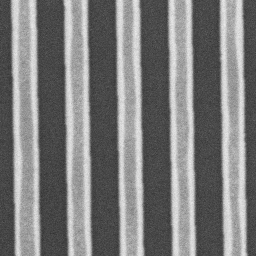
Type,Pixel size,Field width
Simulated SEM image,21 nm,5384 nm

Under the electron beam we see lines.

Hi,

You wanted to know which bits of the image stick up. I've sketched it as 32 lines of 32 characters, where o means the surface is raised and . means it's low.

..oo....ooo....oo....ooo....oo..
..oo....ooo....oo....ooo....oo..
..oo....ooo....oo....ooo....oo..
..oo....ooo....oo.....oo....oo..
..oo....ooo....oo.....oo....oo..
..oo....ooo....oo.....oo....oo..
..oo....ooo....oo.....oo....oo..
..oo....ooo....oo.....oo....oo..
..oo....ooo....oo.....oo....oo..
..oo....ooo....oo.....oo....oo..
..oo....ooo....oo.....oo....oo..
..oo....ooo....oo.....oo....oo..
..oo.....oo....oo.....oo....oo..
..oo.....oo....oo.....oo....oo..
..oo.....oo....oo.....oo....oo..
..oo.....oo....oo.....oo....oo..
..oo.....oo....oo.....oo....oo..
..oo.....oo....oo.....oo....oo..
..ooo....oo....oo.....oo....oo..
..ooo....oo....oo.....oo....oo..
..ooo....oo....oo.....oo....oo..
..ooo....oo....oo.....oo....oo..
..ooo....oo....oo.....oo....oo..
..ooo....oo....oo.....oo....oo..
..ooo....oo....oo.....oo....oo..
..ooo....oo....oo.....oo....oo..
..ooo....oo....ooo....oo....oo..
..ooo....oo....ooo....oo....oo..
..ooo....oo....ooo....oo....oo..
..ooo....oo....ooo....oo....oo..
..ooo....oo....ooo....oo....oo..
..ooo....oo....ooo....oo....oo..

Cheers